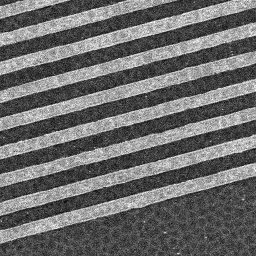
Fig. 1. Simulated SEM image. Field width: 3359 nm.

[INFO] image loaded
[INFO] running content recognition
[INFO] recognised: parallel lines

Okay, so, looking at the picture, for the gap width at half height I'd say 206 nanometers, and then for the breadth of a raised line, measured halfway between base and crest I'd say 11.4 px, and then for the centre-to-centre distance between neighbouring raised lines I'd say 0.356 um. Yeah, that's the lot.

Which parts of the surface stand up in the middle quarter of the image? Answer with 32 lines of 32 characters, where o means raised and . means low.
........oooooooooo..............
....oooooooooo................oo
oooooooooo.................ooooo
ooooooo...............oooooooooo
ooo................ooooooooooo..
...............oooooooooo.......
...........ooooooooooo..........
........ooooooooooo.............
....ooooooooooo...............oo
oooooooooo.................ooooo
oooooo.................ooooooooo
oooo...............ooooooooooo..
...............ooooooooooo......
............oooooooooo..........
........ooooooooooo.............
....oooooooooo................oo
ooooooooooo................ooooo
ooooooo.................oooooooo
ooo................ooooooooooo..
...............ooooooooooo......
...........ooooooooooo..........
........ooooooooooo.............
....ooooooooooo...............oo
ooooooooooo...............oooooo
ooooooo................ooooooooo
ooo................ooooooooooo..
...............ooooooooooo......
...........ooooooooooo..........
........oooooooooo..............
....ooooooooooo...............oo
.oooooooooo...............oooooo
ooooooo................ooooooooo